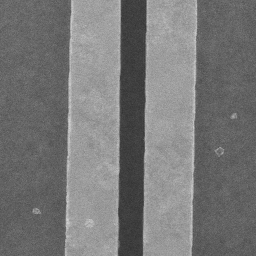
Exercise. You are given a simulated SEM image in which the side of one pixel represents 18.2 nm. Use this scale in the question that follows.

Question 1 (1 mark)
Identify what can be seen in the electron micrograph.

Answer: lines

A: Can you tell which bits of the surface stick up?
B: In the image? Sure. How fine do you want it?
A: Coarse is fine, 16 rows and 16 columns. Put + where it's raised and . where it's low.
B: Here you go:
....++++.+++....
....++++.+++....
....++++.+++....
....++++.+++....
....++++.+++....
....+++..+++....
....+++..+++....
....+++..+++....
....+++..+++....
....+++..+++....
....+++..+++....
....+++..+++....
....+++..+++....
....+++..+++....
....+++..+++....
....+++..+++....